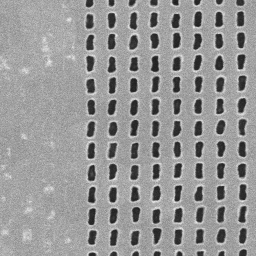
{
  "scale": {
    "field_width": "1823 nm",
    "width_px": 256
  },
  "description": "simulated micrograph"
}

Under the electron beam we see a regular array of holes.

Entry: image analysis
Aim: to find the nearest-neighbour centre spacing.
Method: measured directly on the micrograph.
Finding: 149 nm